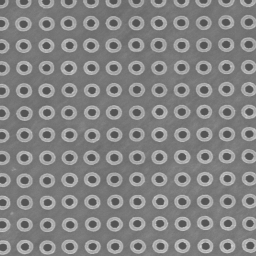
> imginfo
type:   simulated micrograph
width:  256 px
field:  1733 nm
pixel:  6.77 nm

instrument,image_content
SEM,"a regular array of ring-shaped raised bodies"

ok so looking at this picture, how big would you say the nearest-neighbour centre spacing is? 0.147 micrometres